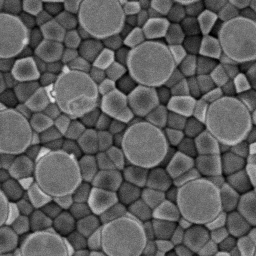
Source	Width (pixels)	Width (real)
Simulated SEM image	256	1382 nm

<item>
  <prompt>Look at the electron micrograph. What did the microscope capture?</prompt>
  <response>a regular array of raised bodies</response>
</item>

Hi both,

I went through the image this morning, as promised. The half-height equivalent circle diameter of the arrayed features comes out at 240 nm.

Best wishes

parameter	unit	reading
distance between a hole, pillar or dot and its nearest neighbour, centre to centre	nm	247